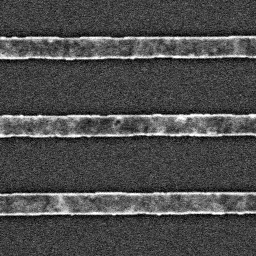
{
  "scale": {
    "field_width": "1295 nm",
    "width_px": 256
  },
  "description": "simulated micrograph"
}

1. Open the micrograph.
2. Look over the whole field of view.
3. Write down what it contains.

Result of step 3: lines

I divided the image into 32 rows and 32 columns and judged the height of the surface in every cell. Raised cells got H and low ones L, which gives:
LLLLLLLLLLLLLLLLLLLLLLLLLLLLLLLL
LLLLLLLLLLLLLLLLLLLLLLLLLLLLLLLL
LLLLLLLLLLLLLLLLLLLLLLLLLLLLLLLL
LLLLLLLLLLLLLLLLLLLLLLLLLLLLLLLL
LLLLLLLLLLLLLLLLLLLLLLLLLLLLLLLL
HHHHHHHHHHHHHHHHHHHHHHHHHHHHHHHH
HHHHHHHHHHHHHHHHHHHHHHHHHHHHHHHH
LLLLLLLLLLLLLLLLLLLLLLLLLLLLLLLL
LLLLLLLLLLLLLLLLLLLLLLLLLLLLLLLL
LLLLLLLLLLLLLLLLLLLLLLLLLLLLLLLL
LLLLLLLLLLLLLLLLLLLLLLLLLLLLLLLL
LLLLLLLLLLLLLLLLLLLLLLLLLLLLLLLL
LLLLLLLLLLLLLLLLLLLLLLLLLLLLLLLL
LLLLLLLLLLLLLLLLLLLLLLLLLLLLLLLL
LLLLLLLLLLLLLLHHHHHHHHHHHHHHHHHH
HHHHHHHHHHHHHHLHHHHHHHHHHHHHHHHH
HHHHHHHHHHHHHHHHHHHHHHHHHHHHHHHH
LLLLLLLLLLLLLLLLLLLLLLLLLLLLLLLL
LLLLLLLLLLLLLLLLLLLLLLLLLLLLLLLL
LLLLLLLLLLLLLLLLLLLLLLLLLLLLLLLL
LLLLLLLLLLLLLLLLLLLLLLLLLLLLLLLL
LLLLLLLLLLLLLLLLLLLLLLLLLLLLLLLL
LLLLLLLLLLLLLLLLLLLLLLLLLLLLLLLL
LLLLLLLLLLLLLLLLLLLLLLLLLLLLLLLL
HHHHHHHHHHHHHHHHHHHHHHHHHHHHHHHH
HHHHHHHHHHHHHHHHHHHHHHHHHHHHHHHH
HHHHHHHHHHHHHHHHHHHHHHHHHHHHHHHH
LLLLLLLLLLLLLLLLLLLLLLLLLLLLLLLL
LLLLLLLLLLLLLLLLLLLLLLLLLLLLLLLL
LLLLLLLLLLLLLLLLLLLLLLLLLLLLLLLL
LLLLLLLLLLLLLLLLLLLLLLLLLLLLLLLL
LLLLLLLLLLLLLLLLLLLLLLLLLLLLLLLL